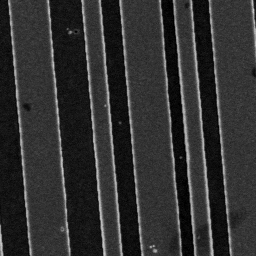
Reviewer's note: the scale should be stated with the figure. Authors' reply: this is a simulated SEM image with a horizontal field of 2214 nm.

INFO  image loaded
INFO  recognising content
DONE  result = lines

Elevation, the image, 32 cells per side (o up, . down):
.ooooo....ooo..ooooo..oo..oooooo
.ooooo....ooo..ooooo..oo..oooooo
.ooooo....ooo..ooooo..oo..oooooo
.ooooo.....oo..ooooo..oo..oooooo
.ooooo.....oo..ooooo..oo..oooooo
..oooo.....oo..ooooo..oo...ooooo
..ooooo....oo...ooooo.ooo..ooooo
..ooooo....oo...ooooo.ooo..ooooo
..ooooo....oo...ooooo.ooo..ooooo
..ooooo....oo...ooooo.ooo..ooooo
..ooooo....oo...ooooo..oo..ooooo
..ooooo....ooo..ooooo..oo..ooooo
..ooooo....ooo..ooooo..oo..ooooo
..ooooo....ooo..ooooo..oo..ooooo
..ooooo....ooo..ooooo..oo..ooooo
..ooooo.....oo..ooooo..oo..ooooo
..ooooo.....oo..ooooo..oo..ooooo
...ooooo....oo..ooooo..oo...oooo
...ooooo....oo...ooooo.oo...oooo
...ooooo....oo...ooooo.ooo..oooo
...ooooo....oo...ooooo.ooo..oooo
...ooooo....oo...ooooo.ooo..oooo
...ooooo....oo...ooooo..oo..oooo
...ooooo....ooo..ooooo..oo..oooo
...ooooo....ooo..ooooo..oo..oooo
...ooooo....ooo..ooooo..oo..oooo
...ooooo.....oo..ooooo..oo..oooo
...ooooo.....oo..ooooo..oo..oooo
...oooooo....oo..ooooo..oo...ooo
....ooooo....oo..ooooo..oo...ooo
....ooooo....oo...ooooo.ooo..ooo
....ooooo....oo...ooooo.ooo..ooo